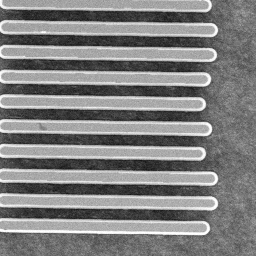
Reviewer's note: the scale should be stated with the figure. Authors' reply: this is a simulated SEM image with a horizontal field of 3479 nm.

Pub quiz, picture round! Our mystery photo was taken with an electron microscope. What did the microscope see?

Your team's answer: groups of lines, slits or small figures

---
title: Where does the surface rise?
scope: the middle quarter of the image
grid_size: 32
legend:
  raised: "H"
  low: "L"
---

LLLLLLLLLLLLLLLLLLLLLLLLLLLLLLLL
LLLLLLLLLLLLLLLLLLLLLLLLLLLLLLLL
HHHHHHHHHHHHHHHHHHHHHHHHHHHHHLLL
HHHHHHHHHHHHHHHHHHHHHHHHHHHHHHHH
HHHHHHHHHHHHHHHHHHHHHHHHHHHHHHHH
LLLLLLLLLLLLLLLLLLLLLLLLLLLLLLLL
LLLLLLLLLLLLLLLLLLLLLLLLLLLLLLLL
LLLLLLLLLLLLLLLLLLLLLLLLLLLLLLLL
HHHHHHHHHHHHHHHHHHHHHHHHLLLLLLLL
HHHHHHHHHHHHHHHHHHHHHHHHHHHHHHHH
HHHHHHHHHHHHHHHHHHHHHHHHHHHHHHHH
LLLLLLLLLLLLLLLLLLLLLLLLLLLLLLLL
LLLLLLLLLLLLLLLLLLLLLLLLLLLLLLLL
LLLLLLLLLLLLLLLLLLLLLLLLLLLLLLLL
HHHHHHHHLLLLLLLLLLLLLLLLLLLLLLLL
HHHHHHHHHHHHHHHHHHHHHHHHHHHHHHHH
HHHHHHHHHHHHHHHHHHHHHHHHHHHHHHHH
LLLLLLLLLLLLLLLLLLLLLLLLHHHHHHHH
LLLLLLLLLLLLLLLLLLLLLLLLLLLLLLLL
LLLLLLLLLLLLLLLLLLLLLLLLLLLLLLLL
HHHLLLLLLLLLLLLLLLLLLLLLLLLLLLLL
HHHHHHHHHHHHHHHHHHHHHHHHHHHHHHHH
HHHHHHHHHHHHHHHHHHHHHHHHHHHHHHHH
LLLLLLLLLLLLLLLLLLLLLHHHHHHHHHHH
LLLLLLLLLLLLLLLLLLLLLLLLLLLLLLLL
LLLLLLLLLLLLLLLLLLLLLLLLLLLLLLLL
LLLLLLLLLLLLLLLLLLLLLLLLLLLLLLLL
HHHHHHHHHHHHHHHHHHHHHHHHHHHHHHHH
HHHHHHHHHHHHHHHHHHHHHHHHHHHHHHHH
HHHHHHHHHHHHHHHHHHHHHHHHHHHHHHHH
LLLLLLLLLLLLLLLLLLLLLLLLLLLLLLLL
LLLLLLLLLLLLLLLLLLLLLLLLLLLLLLLL